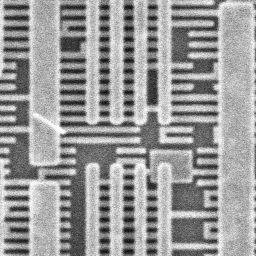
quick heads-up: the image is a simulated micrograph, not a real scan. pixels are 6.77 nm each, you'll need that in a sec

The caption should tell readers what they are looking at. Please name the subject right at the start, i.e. wiring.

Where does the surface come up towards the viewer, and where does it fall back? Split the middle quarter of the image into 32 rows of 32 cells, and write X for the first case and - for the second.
------XXX---XXX---XXX---XXX-----
------XXX---XXX---XXX---XXX-----
------XXX---XXX---XXX---XXX-----
------XXX---XXX---XXX---XXX-----
------XXX---XXX---XXX---XXX-----
------XXX---XXX---XXX---XXX-----
------XXX---XXX---XXX---XXX-----
------XXX---XXX---XXX---XXX-----
------XXX---XXX---XXX---XXX-----
------XXX---XXX---XXX---XXX-----
------XXX---XXX---XXX---XXX-----
------XXX---XXX---XXX---XXX-----
------XXX---XXX---XXX---XXX-----
------XXX---XXX---XXX---XXX-----
------XX----XX----XX----XX------
--------------------------------
--------------------------------
--------------------------------
--------------------------------
--------------------------------
--------------------------------
--------------------------------
--------------------------------
--------------------------------
--------------------------------
------XXX---XX----XX----XXX-----
------XXX---XXX---XX----XXX-----
------XXX---XXX---XX----XXX-----
------XXX---XXX---XX----XXX-----
------XXX---XXX---XX----XXX-----
------XXX---XXX---XX----XXX-----
------XXX---XXX---XX----XXX-----